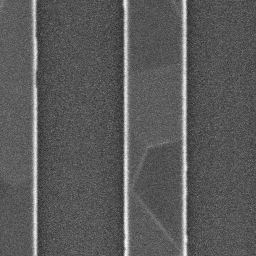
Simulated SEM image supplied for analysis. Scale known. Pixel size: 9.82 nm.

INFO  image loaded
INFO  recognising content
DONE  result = lines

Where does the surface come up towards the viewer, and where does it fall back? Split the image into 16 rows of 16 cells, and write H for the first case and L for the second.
HHLLLLLLHHHHLLLL
HHLLLLLLHHHHLLLL
HHLLLLLLHHHHLLLL
HHLLLLLLHHHHLLLL
HHLLLLLLHHHHLLLL
HHLLLLLLHHHHLLLL
HHLLLLLLHHHHLLLL
HHLLLLLLHHHHLLLL
HHLLLLLLHHHHLLLL
HHLLLLLLHHHHLLLL
HHLLLLLLHHHHLLLL
HHLLLLLLHHHHLLLL
HHLLLLLLHHHHLLLL
HHLLLLLLHHHHLLLL
HHLLLLLLHHHHLLLL
HHLLLLLLHHHHLLLL